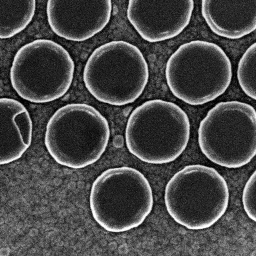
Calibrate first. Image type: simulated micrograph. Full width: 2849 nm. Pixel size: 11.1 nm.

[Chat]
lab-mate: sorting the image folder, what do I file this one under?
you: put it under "raised bodies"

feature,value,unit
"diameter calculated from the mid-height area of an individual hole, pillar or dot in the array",694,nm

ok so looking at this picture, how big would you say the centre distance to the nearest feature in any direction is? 812 nm